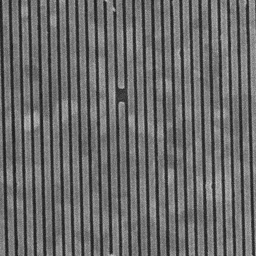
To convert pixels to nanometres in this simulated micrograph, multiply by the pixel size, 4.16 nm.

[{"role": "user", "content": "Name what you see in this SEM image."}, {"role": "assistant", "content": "parallel lines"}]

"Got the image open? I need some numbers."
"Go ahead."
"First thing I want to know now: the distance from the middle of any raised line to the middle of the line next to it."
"39.4 nanometers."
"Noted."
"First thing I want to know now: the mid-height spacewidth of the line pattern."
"0.0146 microns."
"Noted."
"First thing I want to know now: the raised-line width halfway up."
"22.4 nm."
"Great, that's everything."